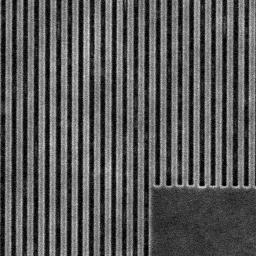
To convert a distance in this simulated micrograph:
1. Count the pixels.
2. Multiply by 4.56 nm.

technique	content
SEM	parallel lines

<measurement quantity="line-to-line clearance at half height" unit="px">5.88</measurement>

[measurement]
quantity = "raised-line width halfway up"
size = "22.2 nanometers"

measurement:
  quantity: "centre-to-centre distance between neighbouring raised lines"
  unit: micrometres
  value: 0.0505